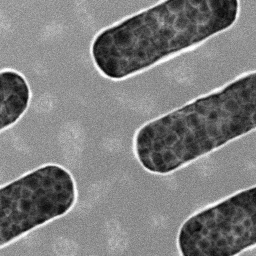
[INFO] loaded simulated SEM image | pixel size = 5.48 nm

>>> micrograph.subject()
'holes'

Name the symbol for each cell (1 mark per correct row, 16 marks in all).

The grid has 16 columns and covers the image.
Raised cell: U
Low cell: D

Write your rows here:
UUUUUUUUUDDDDDDU
UUUUUUUDDDDDDDUU
UUUUUUDDDDDDDUUU
UUUUUUDDDDDUUUUU
DUUUUUUDDUUUUUUU
DDUUUUUUUUUUUUDD
DDUUUUUUUUUUDDDD
DUUUUUUUUUDDDDDD
UUUUUUUUUDDDDDDU
UUUUUUUUUDDDDUUU
UUUDUUUUUDDUUUUU
UDDDDUUUUUUUUUUU
DDDDDUUUUUUUUUDD
DDDDUUUUUUUUDDDD
DDUUUUUUUUUDDDDD
UUUUUUUUUUUDDDDU